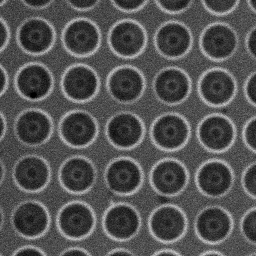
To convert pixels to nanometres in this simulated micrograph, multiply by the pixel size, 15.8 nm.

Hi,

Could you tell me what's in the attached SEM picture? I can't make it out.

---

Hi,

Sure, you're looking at an array of small figures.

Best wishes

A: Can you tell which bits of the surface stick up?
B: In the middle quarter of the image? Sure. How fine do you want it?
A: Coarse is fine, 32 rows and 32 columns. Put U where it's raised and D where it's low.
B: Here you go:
UUUDDUUUUUUUUUUUUUUUUUUUUUUUUUUU
UDDDDDDUUUUUUDDDDDUUUUUUUDDDDUUU
DDDDDDDDUUUUDDDDDDDUUUUUDDDDDDUU
DDDUUDDDUUUDDDDDDDDDUUUDDDDDDDDU
DDDUUDDDDUUDDDUUUDDDUUUDDDUUDDDU
DDDUUDDDUUUDDDUUUDDDUUDDDDUUDDDU
DDDDDDDDUUUDDDDUDDDDUUUDDDUUDDDU
DDDDDDDDUUUUDDDDDDDUUUUDDDDDDDDU
UDDDDDDUUUUUUDDDDDUUUUUUDDDDDDUU
UUUUUUUUUUUUUUUDUUUUUUUUUDDDDUUU
UUUUUUUUUUUUUUUUUUUUUUUUUUUUUUUU
UUUUUUUUUUUUUUUUUUUUUUUUUUUUUUUU
UDDDDDUUUUUUUUDDDUUUUUUUUUDUUUUU
DDDDDDDUUUUUDDDDDDUUUUUUDDDDDUUU
DDDDDDDDUUUDDDDDDDDUUUUDDDDDDDUU
DDUUUDDDUUUDDDUUDDDDUUDDDDDDDDDU
DDUUUDDDUUUDDDUUDDDDUUDDDUUUDDDU
DDDUDDDDUUUDDDUUDDDDUUDDDUUUDDDU
DDDDDDDDUUUDDDDDDDDUUUDDDDDDDDDU
DDDDDDDUUUUUDDDDDDDUUUUDDDDDDDUU
UUDDDUUUUUUUUDDDDDUUUUUUDDDDDUUU
UUUUUUUUUUUUUUUUUUUUUUUUUUDUUUUU
UUUUUUUUUUUUUUUUUUUUUUUUUUUUUUUU
UUDDDUUUUUUUUUUUUUUUUUUUUUUUUUUU
DDDDDDUUUUUUDDDDDDUUUUUUDDDDUUUU
DDDDDDDUUUUDDDDDDDDUUUUDDDDDDDUU
DDDUDDDDUUUDDDDDDDDUUUDDDDDDDDUU
DDUUUDDDUUDDDDUUDDDUUUDDDUUDDDDU
DDUUDDDDUUDDDDUUDDDDUUDDDUUDDDDU
DDDDDDDUUUUDDDDDDDDUUUDDDUUDDDDU
DDDDDDDUUUUDDDDDDDDUUUDDDDDDDDUU
UDDDDDUUUUUUDDDDDDUUUUUDDDDDDUUU